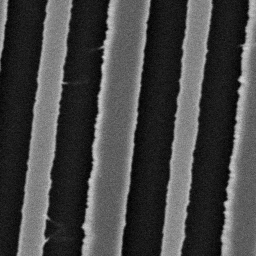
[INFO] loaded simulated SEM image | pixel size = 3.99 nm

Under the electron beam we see lines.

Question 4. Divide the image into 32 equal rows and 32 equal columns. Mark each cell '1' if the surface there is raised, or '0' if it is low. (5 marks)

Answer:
10000011100000111110000111100001
10000011100000111110000111000001
10000011100001111100000111000001
10000011100000111100000111000001
00000111000001111100000111000001
00000111000001111100000111000001
00000111000001111100000111000011
00000111000001111100000111000011
00000111000001111100000111000011
00000111000001111100000110000011
00000111000001111100000110000011
00000111000011111000001110000011
00001111000011111000001110000011
00001110000011111000001110000011
00001110000011111000001110000011
00001110000011111000001110000011
00001110000011111000001110000111
00001110000011111000001100000111
00001110000011111000001100000111
00001110000011111000001100000111
00011110000011110000011100000111
00011100000111110000011100000111
00011100000111110000011100000111
00011100000111110000011100001111
00011100000111110000011100001111
00011100000111110000011100001111
00011100000111110000011000001111
00011100000111110000011000001111
00011100000111100000111000001111
00111100000111100000111000001111
00111100000111100000111000001111
00111000001111100000111000001111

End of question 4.